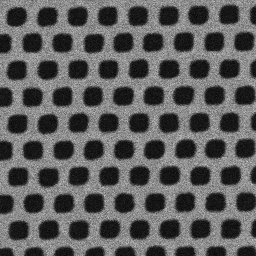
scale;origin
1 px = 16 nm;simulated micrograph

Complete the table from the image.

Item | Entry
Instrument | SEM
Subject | a regular array of holes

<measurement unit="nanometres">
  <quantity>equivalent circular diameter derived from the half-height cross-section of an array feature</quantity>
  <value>334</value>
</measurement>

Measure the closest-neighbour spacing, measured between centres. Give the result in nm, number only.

483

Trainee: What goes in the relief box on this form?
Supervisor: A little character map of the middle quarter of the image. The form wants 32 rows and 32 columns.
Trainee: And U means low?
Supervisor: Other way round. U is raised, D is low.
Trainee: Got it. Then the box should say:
UDDDDDUUUDDDDDUUDDDDDUUUDDDDDUUD
UDDDDDUUUDDDDDUUDDDDDUUUDDDDDUUD
UDDDDDUUUDDDDUUUDDDDDUUUDDDDDUUD
UUDDDUUUUDDDDUUUUDDDUUUUDDDUUUUU
UUUUUUUUUUUUUUUUUUUUUUUUUUUUUUUU
UUUUUUUUUUUUUUUUUUUUUUUUUUUUUUDU
DDUUUDDDDUUUUDDDDUUUDDDDDUUUDDDD
DDUUUDDDDDUUDDDDDDUUDDDDDUUDDDDD
DDUUUDDDDDUUDDDDDDUUDDDDDUUDDDDD
DDUUUDDDDDUUDDDDDUUUDDDDDUUUDDDD
DUUUUUDDUUUUUUDDUUUUUDDUUUUUUUUU
UUUUUUUUUUUUUUUUUUUUUUUUUUUUUUUU
UUUDDUUUUUDDUUUUUDDDDUUUUDDDUUUU
UDDDDDUUUDDDDDUUDDDDDUUUDDDDUUUD
UDDDDDUUUDDDDDUUDDDDDUUUDDDDDUUD
UDDDDDUUDDDDDDUUDDDDDUUUDDDDDUUD
UDDDDDUUUDDDDUUUUDDDDUUUDDDDUUUU
UUUUUUUUUUUUUUUUUUUUUUUUUUUUUUUU
UUUUUUUUUUUUUUUUUUUUUUUUUUUUUUUU
DDUUUUDDDUUUUDDDDUUUUDDDDUUUDDDD
DDDUUDDDDDUUUDDDDUUUDDDDDUUUDDDD
DDDUUDDDDDUUDDDDDDUUDDDDDUUUDDDD
DDUUUDDDDDUUUDDDDUUUDDDDDUUUDDDD
DDUUUDDDDUUUUDDDDUUUUDDDUUUUDDDD
UUUUUUUUUUUUUUUUUUUUUUUUUUUUUUUU
UUUUUUUUUUUUUUUUUUUDUUUUUUUUUUUU
UDDDDDUUUDDDDDUUUDDDDUUUDDDDDUUU
UDDDDDUUUDDDDDUUDDDDDUUUDDDDDUUU
UDDDDDUUUDDDDDUUDDDDDUUUDDDDDUUU
UDDDDDUUUDDDDDUUDDDDDUUUDDDDDUUU
UUUUUUUUUUDDUUUUUUDDUUUUUDUUUUUU
UUUUUUUUUUUUUUUUUUUUUUUUUUUUUUUU